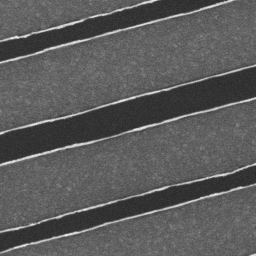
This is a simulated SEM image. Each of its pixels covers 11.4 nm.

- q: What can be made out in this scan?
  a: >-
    one or a few lines or trenches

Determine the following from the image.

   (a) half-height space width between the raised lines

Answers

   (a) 751 nanometres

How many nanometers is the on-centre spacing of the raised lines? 1040